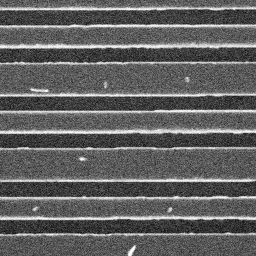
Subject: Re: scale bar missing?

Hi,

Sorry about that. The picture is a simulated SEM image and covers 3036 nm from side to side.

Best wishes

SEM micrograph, lines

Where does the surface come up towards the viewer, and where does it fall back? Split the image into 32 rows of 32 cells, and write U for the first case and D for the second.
UUUUUUUUUUUUUUUUUUUUUUUUUUUUUUUU
DDDDDDDDDDDDDDDDDDDDDDDDDDDDDDDD
DDDDDDDDDDDDDDDDDDDDDDDDDDDDDDDD
UUUUUUUUUUUUUUUUUUUUUUUUUUUUUUUU
UUUUUUUUUUUUUUUUUUUUUUUUUUUUUUUU
UUUUUUUUUUUUUUUUUUUUUUUUUUUUUUUU
DDDDDDDDDDDDDDDDDDDDDDDDDDDDDDDD
DDDDDDDDDDDDDDDDDDDDDDDDDDDDDDDD
UUUUUUUUUUUUUUUUUUUUUUUUUUUUUUUU
UUUUUUUUUUUUUUUUUUUUUUUUUUUUUUUU
UUUUUUUUUUUUUUUUUUUUUUUUUUUUUUUU
UUUUUUUUUUUUUUUUUUUUUUUUUUUUUUUU
DDDDDDDDDDDDDDDDDDDDDDDDDDDDDDDD
DDDDDDDDDDDDDDDDDDDDDDDDDDDDDDDD
UUUUUUUUUUUUUUUUUUUUUUUUUUUUUUUU
UUUUUUUUUUUUUUUUUUUUUUUUUUUUUUUU
UUUUUUUUUUUUUUUUUUUUUDDUUUUDUUUU
DDDDDDDDDDDDDDDDDDDDDDDDDDDDDDDD
DDDDDDDDDDDDDDDDDDDDDDDDDDDDDDDD
UUUUUUUUUUUUUUUUUUUUUUUUUUUUUUUU
UUUUUUUUUUUUUUUUUUUUUUUUUUUUUUUU
UUUUUUUUUUUUUUUUUUUUUUUUUUUUUUUU
UUUUUUUUUUUUUUUUUUUUUUUUUUUUUUUU
DDDDDDDDDDDDDDDDDDDDDDDDDDDDDDDD
DDDDDDDDDDDDDDDDDDDDDDDDDDDDDDDD
UUUUUUUUUUUUUUUUUUUUUUUUUUUUUUUU
UUUUUUUUUUUUUUUUUUUUUUUUUUUUUUUU
DDDDDDDDDDDDDDDDDDDDDDDDDDDDDDDD
DDDDDDDDDDDDDDDDDDDDDDDDDDDDDDDD
UUUUUUUUUUUUUUUUUUUUUUUUUUUUUUUU
UUUUUUUUUUUUUUUUUUUUUUUUUUUUUUUU
UUUUUUUUUUUUUUUUUUUUUUUUUUUUUUUU